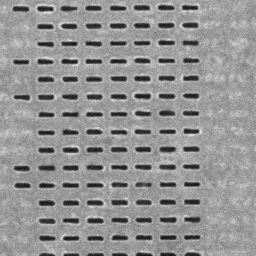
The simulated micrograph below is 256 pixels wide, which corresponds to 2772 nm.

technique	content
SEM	a regular array of holes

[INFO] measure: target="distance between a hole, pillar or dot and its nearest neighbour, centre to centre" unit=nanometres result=190